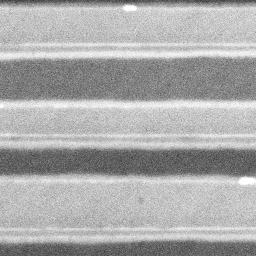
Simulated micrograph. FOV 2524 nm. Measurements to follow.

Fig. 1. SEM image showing lines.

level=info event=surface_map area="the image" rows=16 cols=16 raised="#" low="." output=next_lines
##..#####......#
################
################
................
................
................
................
################
################
................
................
################
################
################
################
................